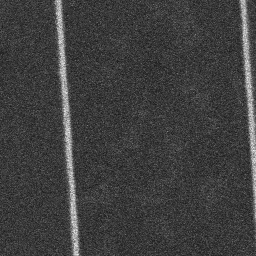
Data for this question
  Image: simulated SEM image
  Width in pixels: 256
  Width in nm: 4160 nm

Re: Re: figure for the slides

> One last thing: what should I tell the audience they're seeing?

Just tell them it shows one or a few lines or trenches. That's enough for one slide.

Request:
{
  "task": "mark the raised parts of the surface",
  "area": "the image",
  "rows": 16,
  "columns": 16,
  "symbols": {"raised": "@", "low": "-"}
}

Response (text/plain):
@@@@-----------@
@@@@-----------@
@@@@-----------@
@@@@-----------@
@@@@-----------@
@@@@------------
@@@@------------
@@@@------------
@@@@------------
@@@@------------
@@@@------------
@@@@@-----------
@@@@@-----------
@@@@@-----------
@@@@@-----------
@@@@@-----------